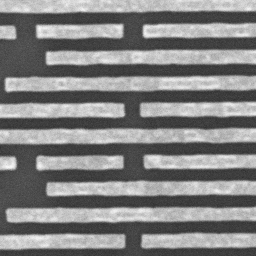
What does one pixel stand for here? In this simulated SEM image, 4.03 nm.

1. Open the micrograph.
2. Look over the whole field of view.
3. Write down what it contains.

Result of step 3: wiring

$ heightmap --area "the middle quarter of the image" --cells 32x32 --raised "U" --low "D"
DDDDDDDDDDDDDDDDDDDDDDDDDDDDDDDD
DDDDDDDDDDDDDDDDDDDDDDDDDDDDDDDD
DDDDDDDDDDDDDDDDDDDDDDDDDDDDDDDD
UUUDDDDDDUUUDUUUUUUUUUUUUUUUUUUU
UUUUUUUUUUUUUUUUUUUUUUUUUUUUUUUU
UUUUUUUUUUUUUUUUUUUUUUUUUUUUUUUU
DUUDDDDDDUUUUUUUUUUUUUUDDDDDDDDD
DDDDDDDDDDDDDDDDDDDDDDDDDDDDDDDD
DDDDDDDDDDDDDDDDDDDDDDDDDDDDDDDD
DDDDDDDDDDDDDDDDDDDDDDDDDDDDDDDD
UUUUUUUUUUUUUUUDDDDUUUUUUUUUUUUU
UUUUUUUUUUUUUUUDDDDUUUUUUUUUUUUU
UUUUUUUUUUUUUUUDDDDUUUUUUUUUUUUU
DDDDDDDDDDDDDDDDDDDDDDDDDDDDDDDD
DDDDDDDDDDDDDDDDDDDDDDDDDDDDDDDD
DDDDDDDDDDDDDDDDDDDDDDDDDDDDDDDD
UDUUUDDDDDUUUUUUUUUUDDDUUUUUUUUU
UUUUUUUUUUUUUUUUUUUUUUUUUUUUUUUU
UUUUUUUUUUUUUUUUUUUUUUUUUUUUUUUU
UUUUUUUUUUUUUUUUUUUUUUUUUUUDDDUD
DDDDDDDDDDDDDDDDDDDDDDDDDDDDDDDD
DDDDDDDDDDDDDDDDDDDDDDDDDDDDDDDD
DDDDDDDDDDDDDDDDDDDDDDDDDDDDDDDD
UUUUUUUUUUUUUUUDDDDDUUUUUUUUUUUU
UUUUUUUUUUUUUUUDDDDDUUUUUUUUUUUU
UUUUUUUUUUUUUUUDDDDDUUUUUUUUUUUU
DDDDDDDDDDDDDDDDDDDDDDDDDDDDDDDD
DDDDDDDDDDDDDDDDDDDDDDDDDDDDDDDD
DDDDDDDDDDDDDDDDDDDDDDDDDDDDDDDD
DDDDDDDDDDDDDDDDDDUUUDDDDDDDDDDD
UUUUUUUUUUUUUUUUUUUUUUUUUUUUUUUU
UUUUUUUUUUUUUUUUUUUUUUUUUUUUUUUU